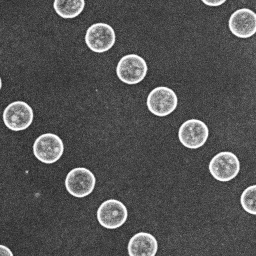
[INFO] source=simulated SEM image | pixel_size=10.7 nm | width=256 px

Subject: a regular array of raised bodies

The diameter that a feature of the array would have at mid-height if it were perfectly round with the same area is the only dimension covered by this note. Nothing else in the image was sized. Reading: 299 nanometres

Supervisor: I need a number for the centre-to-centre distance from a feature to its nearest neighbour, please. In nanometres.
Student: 479